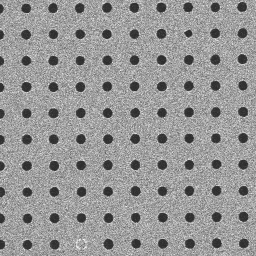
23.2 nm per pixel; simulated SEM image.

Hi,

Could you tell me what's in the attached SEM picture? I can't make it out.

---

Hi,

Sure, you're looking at a regular array of holes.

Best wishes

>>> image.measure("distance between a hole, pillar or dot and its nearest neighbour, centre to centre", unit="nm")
605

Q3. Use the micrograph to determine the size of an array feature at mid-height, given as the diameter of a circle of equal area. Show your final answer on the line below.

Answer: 234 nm